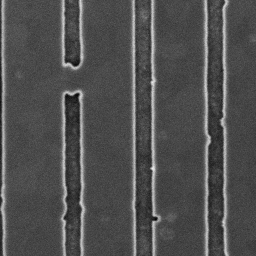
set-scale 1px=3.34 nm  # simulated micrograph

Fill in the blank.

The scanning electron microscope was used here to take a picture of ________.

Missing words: one or a few lines or trenches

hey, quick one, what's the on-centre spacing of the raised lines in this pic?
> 244 nm